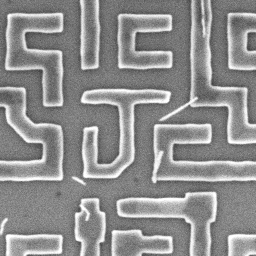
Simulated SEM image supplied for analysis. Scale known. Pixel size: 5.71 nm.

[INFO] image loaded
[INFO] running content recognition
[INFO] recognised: wiring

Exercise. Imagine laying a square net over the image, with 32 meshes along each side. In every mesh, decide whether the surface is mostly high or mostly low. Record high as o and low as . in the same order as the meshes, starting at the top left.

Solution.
..........oo............oo......
..........oo............oo......
.ooooooo..oo...oooooo...oo...ooo
.ooooooo..oo...oooooo...oo...ooo
.oo.......oo...oo.......oo...oo.
.oo.......oo...oo.......oo...oo.
.oooooo...oo...oooooo...oo...ooo
.ooooooo..oo...oooooo...oo...ooo
.ooooooo...o....ooo.....oo...ooo
.....ooo................oo......
.....ooo................oo......
ooo..ooo...oooooooooo...ooooooo.
ooo..ooo..ooooooooooo...ooooooo.
.oo............oo...........ooo.
.oo............oo............oo.
.oooo..........oo............oo.
..oooooo..oo...oo..ooooooo...ooo
...ooooo..oo...oo..ooooooo...ooo
.....ooo..oo...oo..ooo..........
.....ooo..oo...oo..ooo..........
oooooooo..oooooo...ooooooooooooo
oooooooo..ooooo....ooooooooooooo
oooo...............o...oooooooo.
................................
.......................oooo.....
..........oo...oooooooooooo.....
..........ooo..oooooooooooo.....
..........ooo..........oooo.....
.........oooo...........oo......
.oo.ooo..oooo.oooo......oo...ooo
.ooooooo..ooo.oooooooo..oo...ooo
.oooooo...oo..ooooooo...oo...ooo